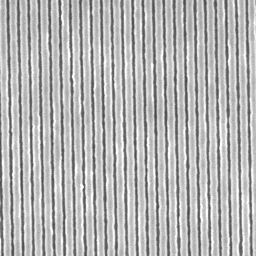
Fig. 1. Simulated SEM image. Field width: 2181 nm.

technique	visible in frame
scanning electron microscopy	parallel lines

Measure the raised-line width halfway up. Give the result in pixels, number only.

7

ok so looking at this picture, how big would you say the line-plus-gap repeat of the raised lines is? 88.4 nm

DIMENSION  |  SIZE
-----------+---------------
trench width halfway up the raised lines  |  29.8 nanometres